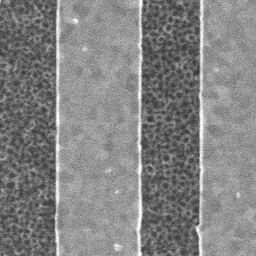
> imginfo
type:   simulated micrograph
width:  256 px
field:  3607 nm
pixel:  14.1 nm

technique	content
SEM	one or a few lines or trenches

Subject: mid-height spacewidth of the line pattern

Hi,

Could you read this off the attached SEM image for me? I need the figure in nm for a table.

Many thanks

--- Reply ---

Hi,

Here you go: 858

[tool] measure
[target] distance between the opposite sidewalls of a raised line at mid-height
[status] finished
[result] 1.17 um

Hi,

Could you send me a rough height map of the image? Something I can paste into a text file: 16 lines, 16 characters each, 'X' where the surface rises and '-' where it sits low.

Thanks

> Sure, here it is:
----XXXXX----XXX
----XXXXX----XXX
----XXXXX----XXX
----XXXXX----XXX
----XXXXX----XXX
----XXXXX----XXX
----XXXXX----XXX
----XXXXX----XXX
----XXXXX----XXX
----XXXXX----XXX
----XXXXX----XXX
----XXXXX----XXX
----XXXXX----XXX
----XXXXX----XXX
----XXXXX---XXXX
----XXXXX----XXX